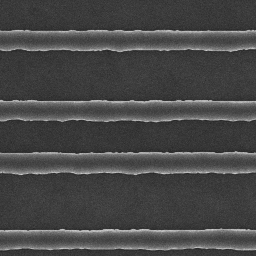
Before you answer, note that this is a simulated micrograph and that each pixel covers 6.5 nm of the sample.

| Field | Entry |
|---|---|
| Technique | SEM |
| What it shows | lines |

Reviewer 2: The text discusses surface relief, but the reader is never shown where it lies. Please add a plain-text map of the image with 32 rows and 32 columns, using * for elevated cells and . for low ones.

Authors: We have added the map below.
................................
................................
................................
................................
********************************
********************************
................................
................................
................................
................................
................................
................................
................................
********************************
********************************
................................
................................
................................
................................
********************************
********************************
********.*****************.*****
................................
................................
................................
................................
................................
................................
................................
********************************
********************************
................................